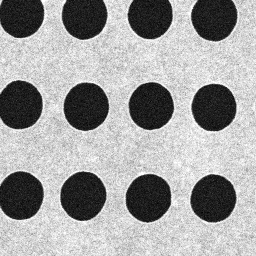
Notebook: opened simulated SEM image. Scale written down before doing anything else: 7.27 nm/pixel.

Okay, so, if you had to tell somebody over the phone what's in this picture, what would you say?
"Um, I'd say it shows holes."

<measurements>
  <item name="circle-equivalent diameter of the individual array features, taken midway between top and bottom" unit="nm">343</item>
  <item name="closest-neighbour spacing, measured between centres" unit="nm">472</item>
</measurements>